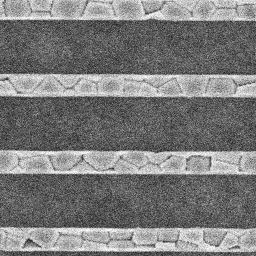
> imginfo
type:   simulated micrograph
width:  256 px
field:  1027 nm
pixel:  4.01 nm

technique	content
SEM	one or a few lines or trenches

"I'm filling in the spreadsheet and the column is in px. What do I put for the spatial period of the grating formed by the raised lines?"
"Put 77.1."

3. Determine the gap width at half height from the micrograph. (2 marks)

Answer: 219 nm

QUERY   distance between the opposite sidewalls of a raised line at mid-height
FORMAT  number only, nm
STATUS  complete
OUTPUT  91.5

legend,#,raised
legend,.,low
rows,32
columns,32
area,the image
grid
################################
################################
.....................#...#######
................................
................................
................................
................................
................................
................................
################################
################################
################################
................................
................................
................................
................................
................................
................................
................................
################################
################################
################################
................................
................................
................................
................................
................................
................................
######.######...........#.......
################################
################################
................................